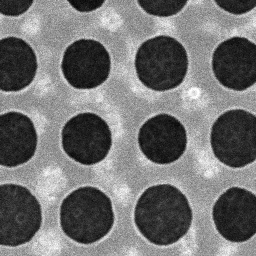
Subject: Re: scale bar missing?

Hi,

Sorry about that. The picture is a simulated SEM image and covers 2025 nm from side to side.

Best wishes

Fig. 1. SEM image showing holes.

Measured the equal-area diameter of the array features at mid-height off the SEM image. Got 423 nanometres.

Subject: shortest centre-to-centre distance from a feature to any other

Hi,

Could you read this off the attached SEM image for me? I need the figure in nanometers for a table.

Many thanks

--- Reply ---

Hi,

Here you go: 596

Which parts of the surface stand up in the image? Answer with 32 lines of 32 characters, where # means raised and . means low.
....#####....####......####.....
...#######.#######....######...#
################################
################################
####################.###########
....#####....#####.....####.....
....####......###......####.....
.....###......###.......##......
.....###......###......####.....
....####......###......####.....
....#####....#####.....#####....
#.##############################
################################
################################
...######...#######...#####.....
....####.....#####.....####.....
.....###......###......###......
.....###......###......###......
.....###......###......###......
....#####....#####.....####.....
...#######..########.#######...#
################################
################################
...#######..#######...#######.##
....####.....#####.....#####....
.....###......###.......###.....
.....##.......###.......###.....
.....##.......###.......###.....
.....###......###.......###.....
....####.....#####.....#####....
...#######.########..###########
################################